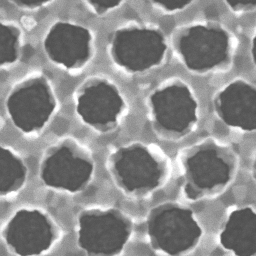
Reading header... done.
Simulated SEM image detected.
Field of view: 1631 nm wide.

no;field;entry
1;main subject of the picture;a regular array of holes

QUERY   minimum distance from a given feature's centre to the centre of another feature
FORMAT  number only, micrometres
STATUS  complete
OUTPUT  0.433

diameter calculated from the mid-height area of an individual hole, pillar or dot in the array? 307 nm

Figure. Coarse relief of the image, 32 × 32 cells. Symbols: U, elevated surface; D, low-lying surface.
UUUDDUUUUUUDDDDUUUUUDDDUUUUUUDDD
UUUUUUUUUUUUUUUUUUUUUUUUUUUUUUUU
UUUUUUUUUUUUUUUUUUUUUUUUUUUUUUUU
DDUUUUDDDDUUUUUUDUUUUUUUDDUUUUUU
DDUUUUDDDDDUUUUDDDDDUUDDDDDDUUUU
DDUUUUDDDDDUUUDDDDDDUUDDDDDDDUUU
DDUUUUDDDDDUUUDDDDDDDUDDDDDDDUUD
DDUUUUUDDDDUUUUDDDDDUUUDDDDDUUUU
UUUUUUUUUDUUUUUUDDUUUUUUDDUUUUUU
UUUUUUUUUUUUUUUUUUUUUUUUUUUUUUUU
UUUDDDUUUUUDDDUUUUUUUUUUUUUUUDUU
UUDDDDUUUUDDDDDUUUUDDDDDUUUUDDDD
UDDDDDDUUUDDDDDUUUUDDDDDUUUDDDDD
UDDDDDDUUUDDDDDUUUUDDDDDUUUDDDDD
UDDDDDUUUUDDDDDUUUUDDDDDDUUDDDDD
UUDDDUUUUUUDDDUUUUUUDDDDUUUUDDDD
UUUDUUUUUUUUUUUUUUUUDDDDUUUUUUUU
UUUUUUUUUUUUUUUUUUUUUUUUUUUUUUUU
UUUUUUUDDUUUUUUDDDUUUUUUDDDUUUUU
DDUUUUDDDDDUUUDDDDDDUUUDDDDDDUUU
DDDUUDDDDDDUUUDDDDDDUUUDDDDDDUUU
DDDUUDDDDDDUUUDDDDDDUUUDDDDDDUUU
DDDUUDDDDDDUUUUDDDDDUUUUDDDDDUUU
DDUUUUUUDDUUUUUDDDDUUUUDDDDUUUUU
UUUUUUUUUUUUUUUUUUUUUUUDDUUUUUUU
UUUUUUUUUUUUUUUUUUUUUUUUUUUUUUUU
UUDDDUUUUUUUUDUUUUUDDDDDUUUUUDDD
UUDDDDUUUUDDDDDUUUUDDDDDUUUUUDDD
UDDDDDDUUUDDDDDDUUUDDDDDDUUUDDDD
UDDDDDDUUUDDDDDDUUUDDDDDDUUUDDDD
UDDDDDUUUUDDDDDDUUUDDDDDDUUUDDDD
UUDDDUUUUUUDDDDUUUUUUDDUUUUUUDDD